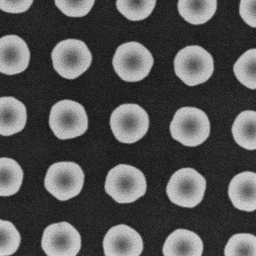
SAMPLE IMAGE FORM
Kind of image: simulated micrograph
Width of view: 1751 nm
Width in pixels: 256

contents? an array of small figures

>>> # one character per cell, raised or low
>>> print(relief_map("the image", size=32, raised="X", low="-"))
XXXX---XXXXX---XXXX---XXXXX---XX
-XX-----XXX----XXXX---XXXXX---XX
----------------XX-----XXX----XX
--------------------------------
-X------------------------------
XXX----XXXX----XXX--------------
XXXX--XXXXX---XXXXX---XXXX-----X
XXXX--XXXXX---XXXXX---XXXXX---XX
XXX----XXXX---XXXXX---XXXXX--XXX
--------XX-----XXX----XXXX---XXX
-----------------------XX-----XX
--------------------------------
XX------X-----------------------
XXX---XXXX-----XXX-----XX-------
XXX---XXXXX---XXXX----XXXX----XX
XXX---XXXXX---XXXXX--XXXXX---XXX
XX-----XXXX---XXXX---XXXXX---XXX
---------------XX-----XXXX---XXX
-------------------------------X
--------------------------------
XX-----XXX----------------------
XXX---XXXX----XXXX----XXX-----X-
XXX---XXXXX--XXXXX---XXXXX---XXX
XX----XXXX---XXXXX---XXXXX---XXX
-------XX-----XXXX---XXXX----XXX
----------------------XXX----XXX
--------------------------------
--------------------------------
XX----XXX-----XX----------------
XX---XXXXX---XXXXX---XXXX----XXX
XX---XXXXX---XXXXX--XXXXX---XXXX
XX----XXXX---XXXXX--XXXXX---XXXX